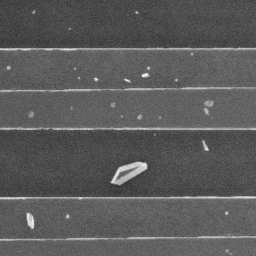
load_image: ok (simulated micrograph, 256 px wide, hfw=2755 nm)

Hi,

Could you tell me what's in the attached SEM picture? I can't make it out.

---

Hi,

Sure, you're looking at lines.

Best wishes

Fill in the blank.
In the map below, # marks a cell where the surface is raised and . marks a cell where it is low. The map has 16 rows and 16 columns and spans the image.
................
................
................
################
################
################
################
################
................
................
................
................
################
################
################
################